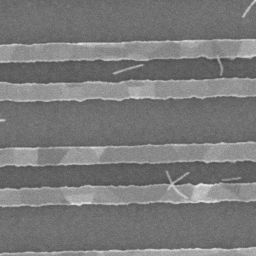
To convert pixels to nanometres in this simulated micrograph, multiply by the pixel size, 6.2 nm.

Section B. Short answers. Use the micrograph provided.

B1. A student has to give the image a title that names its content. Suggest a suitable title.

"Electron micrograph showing lines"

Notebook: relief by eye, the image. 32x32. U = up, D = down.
DDDDDDDDDDDDDDDDDDDDDDDDDDDDDDDD
DDDDDDDDDDDDDDDDDDDDDDDDDDDDDDDD
DDDDDDDDDDDDDDDDDDDDDDDDDDDDDDDD
DDDDDDDDDDDDDDDDDDDDDDDDDDDDDDDD
DDDDDDDDDDDDDDDDDDDDDDDDDDDDDDDD
DDDDDDUUUUUUUUUUUUUUUUUUUUUUUUUU
UUUUUUUUUUUUUUUUUUUUUUUUUUUUUUUU
UUUUUUUUUUUUDUUDDUUDDDDDDDDDDDDD
DDDDDDDDDDDDDDDDDDDDDDDDDDDDDDDD
DDDDDDDDDDDDDDDDDDDDDDDDDDDDDDDD
UUDUUDUUUUUUUUUUUUUUUUUUUUUUUUUU
UUUUUUUUUUUUUUUUUUUUUUUUUUUUUUUU
UUUUUUUUUUUDDDUDDDDDDDDDDDDDDDDD
DDDDDDDDDDDDDDDDDDDDDDDDDDDDDDDD
DDDDDDDDDDDDDDDDDDDDDDDDDDDDDDDD
DDDDDDDDDDDDDDDDDDDDDDDDDDDDDDDD
DDDDDDDDDDDDDDDDDDDDDDDDDDDDDDDD
DDDDDDDDDDDDDDDDDDDDDDDDDDDDDDDD
DDDDUDUUUUUUUUUUUUUUUUUUUUUUUUUU
UUUUUUUUUUUUUUUUUUUUUUUUUUUUUUUU
UUUUUUUUUUUUDDDDDDDDDDDDDDDDDDDD
DDDDDDDDDDDDDDDDDDDDDDDDDDDDDDDD
DDDDDDDDDDDDDDDDDDDDDDDDDDDDDDDD
DDDDDUUUUUUUUUUUUUUUUUUUUUUUUUUU
UUUUUUUUUUUUUUUUUUUUUUUUUUUUUUUU
UUUUUUUUUUUDUUUUDDDDDDDDDDDDDDDD
DDDDDDDDDDDDDDDDDDDDDDDDDDDDDDDD
DDDDDDDDDDDDDDDDDDDDDDDDDDDDDDDD
DDDDDDDDDDDDDDDDDDDDDDDDDDDDDDDD
DDDDDDDDDDDDDDDDDDDDDDDDDDDDDDDD
DDDDDDDDDDDDDDDDDDDDDDDDDDDDDDDD
DDDDDDDUUUUUUUUUUUUUUUUUUUUUUUUU